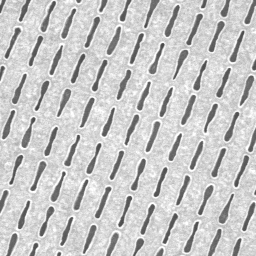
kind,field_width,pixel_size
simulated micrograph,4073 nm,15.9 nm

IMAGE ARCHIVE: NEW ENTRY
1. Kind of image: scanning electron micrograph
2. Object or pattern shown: a regular array of holes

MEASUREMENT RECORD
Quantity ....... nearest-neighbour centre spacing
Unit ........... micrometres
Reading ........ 0.372